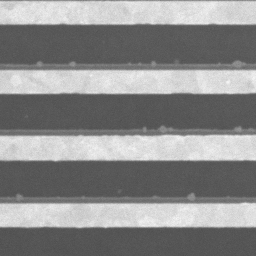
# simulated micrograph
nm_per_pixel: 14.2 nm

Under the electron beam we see lines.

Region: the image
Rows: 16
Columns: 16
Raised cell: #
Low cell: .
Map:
################
................
................
................
################
################
................
................
################
################
................
................
################
################
................
................